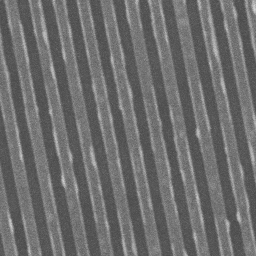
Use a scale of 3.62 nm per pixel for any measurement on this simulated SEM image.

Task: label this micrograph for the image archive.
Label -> parallel lines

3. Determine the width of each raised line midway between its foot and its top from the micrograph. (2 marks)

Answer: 43.5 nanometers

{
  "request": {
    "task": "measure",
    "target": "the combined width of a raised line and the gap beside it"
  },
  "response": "85.2 nm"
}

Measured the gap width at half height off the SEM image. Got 40.4 nm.